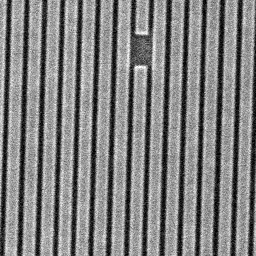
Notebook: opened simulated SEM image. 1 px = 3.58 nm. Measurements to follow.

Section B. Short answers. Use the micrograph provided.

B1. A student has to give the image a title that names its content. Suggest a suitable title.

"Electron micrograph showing parallel lines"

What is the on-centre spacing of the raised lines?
0.0635 microns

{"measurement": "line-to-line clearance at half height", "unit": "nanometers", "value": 26.4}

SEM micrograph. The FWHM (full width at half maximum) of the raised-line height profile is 0.0398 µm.